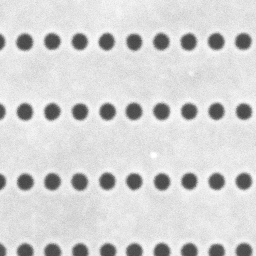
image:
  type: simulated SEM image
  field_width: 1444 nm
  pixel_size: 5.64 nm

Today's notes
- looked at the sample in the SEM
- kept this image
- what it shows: a regular array of holes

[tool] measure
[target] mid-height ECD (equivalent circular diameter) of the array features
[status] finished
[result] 17.9 pixels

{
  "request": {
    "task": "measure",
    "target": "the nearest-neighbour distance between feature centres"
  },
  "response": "154 nm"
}